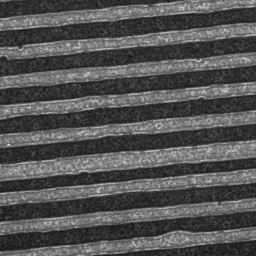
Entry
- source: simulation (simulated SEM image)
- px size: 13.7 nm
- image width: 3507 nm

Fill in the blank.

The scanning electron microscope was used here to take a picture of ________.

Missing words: parallel lines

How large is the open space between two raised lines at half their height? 164 nm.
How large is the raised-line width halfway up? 240 nm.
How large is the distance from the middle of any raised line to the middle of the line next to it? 397 nm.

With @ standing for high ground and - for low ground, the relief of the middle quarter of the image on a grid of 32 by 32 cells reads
@@@@@@@@@@@@@@------------------
@-------------------------------
------------------------@@@@@@@@
--------------@@@@@@@@@@@@@@@@@@
-@-@@@@@@@@@@@@@@@@@@@@@@@@@@@@@
@@@@@@@@@@@@@@@@@@@@@@@@@@@@@@@@
@@@@@@@@@@@@@@@@@@@@@@@@@@@-----
@@@@@@@@@@@@@@@@----------------
@@@@----------------------------
--------------------------@@@@@@
----------------@-@@@@@@@@@@@@@@
-----@@@@@@@@@@@@@@@@@@@@@@@@@@@
@@@@@@@@@@@@@@@@@@@@@@@@@@@@@@@@
@@@@@@@@@@@@@@@@@@@@@@@@@@------
@@@@@@@@@@@@@@@@@@@@------------
@@@@@@@@@@----------------------
-------------------------------@
------------------@@@@@@@@@@@@@@
--------@@@@@@@@@@@@@@@@@@@@@@@@
@@@@@@@@@@@@@@@@@@@@@@@@@@@@@@@@
@@@@@@@@@@@@@@@@@@@@@@@@@@@@@@@@
@@@@@@@@@@@@@@@@@@@@@@@---------
@@@@@@@@@@----------------------
--------------------------------
--------------------------------
------------------------@@@@@@@@
------------@@@@@@@@@@@@@@@@@@@@
@@-@@@@@@@@@@@@@@@@@@@@@@@@@@@@@
@@@@@@@@@@@@@@@@@@@@@@@@@-------
@@@@@@@@@@@@@@------------------
@@@@----------------------------
------------------------@@@@@@@@